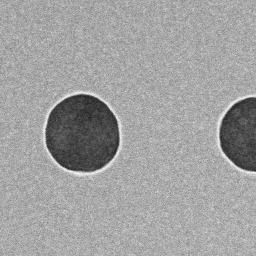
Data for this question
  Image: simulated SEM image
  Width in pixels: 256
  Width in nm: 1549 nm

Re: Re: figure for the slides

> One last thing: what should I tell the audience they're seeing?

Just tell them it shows holes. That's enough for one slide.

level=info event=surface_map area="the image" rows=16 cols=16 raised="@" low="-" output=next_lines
@@@@@@@@@@@@@@@@
@@@@@@@@@@@@@@@@
@@@@@@@@@@@@@@@@
@@@@@@@@@@@@@@@@
@@@@@@@@@@@@@@@@
@@@@@@@@@@@@@@@@
@@@@---@@@@@@@@-
@@@----@@@@@@@--
@@@----@@@@@@@--
@@@----@@@@@@@--
@@@@--@@@@@@@@@-
@@@@@@@@@@@@@@@@
@@@@@@@@@@@@@@@@
@@@@@@@@@@@@@@@@
@@@@@@@@@@@@@@@@
@@@@@@@@@@@@@@@@